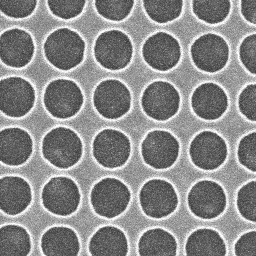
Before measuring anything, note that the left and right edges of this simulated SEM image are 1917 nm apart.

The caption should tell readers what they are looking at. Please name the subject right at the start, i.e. a regular array of holes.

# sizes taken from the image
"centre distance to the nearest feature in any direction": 0.363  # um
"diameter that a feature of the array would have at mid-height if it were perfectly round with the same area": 298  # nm